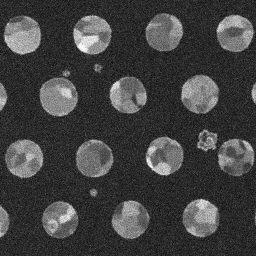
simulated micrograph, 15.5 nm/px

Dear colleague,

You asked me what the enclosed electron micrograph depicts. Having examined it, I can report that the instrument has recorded a regular array of raised bodies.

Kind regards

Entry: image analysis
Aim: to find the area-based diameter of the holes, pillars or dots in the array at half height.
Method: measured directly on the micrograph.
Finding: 0.568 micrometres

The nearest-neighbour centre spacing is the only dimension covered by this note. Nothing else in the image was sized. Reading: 1090 nanometres